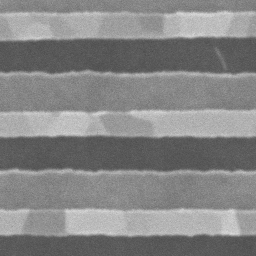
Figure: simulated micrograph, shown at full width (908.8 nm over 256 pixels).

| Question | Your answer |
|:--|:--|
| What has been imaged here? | lines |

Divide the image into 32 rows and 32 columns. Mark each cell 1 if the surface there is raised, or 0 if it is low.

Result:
11111111111111111111111111111111
11111111111111111111111111111111
11111111111111111111111111111111
11111111111111111111111111111111
11111111111111111111111111111111
00000000000000000000000000000000
00000000000000000000000000000000
00000000000000000000000000000000
00000000000000000000000000000000
11111111111111111111111111111111
11111111111111111111111111111111
11111111111111111111111111111111
11111111111111111111111111111111
11111111111111111111111111111111
11111111111111111111111111111111
11111111111111111111111111111111
11111111111111111111111111111111
00000000000000000000000000000000
00000000000000000000000000000000
00000000000000000000000000000000
00000000000000000000000000000000
11111111111011111111011110111111
11111111111111111111111111111111
11111111111111111111111111111111
11111111111111111111111111111111
11111111111111111111111111111111
11111111111111111111111111111111
11111111111111111111111111111111
11111111111111111111111111111111
00000000000000000000000000000000
00000000000000000000000000000000
00000000000000000000000000000000